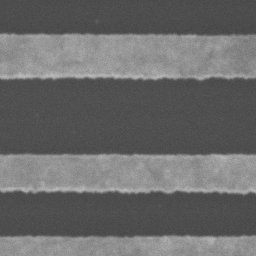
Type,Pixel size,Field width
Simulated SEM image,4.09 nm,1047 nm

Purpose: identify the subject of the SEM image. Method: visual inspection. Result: lines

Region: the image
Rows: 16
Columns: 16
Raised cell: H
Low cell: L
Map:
LLLLLLLLLLLLLLLL
LLLLLLLLLLLLLLLL
HHHHHHHHHHHHHHHH
HHHHHHHHHHHHHHHH
HHHHHHHHHHHHHHHH
LLLLLLLLLLLLLLLL
LLLLLLLLLLLLLLLL
LLLLLLLLLLLLLLLL
LLLLLLLLLLLLLLLL
LLLLLLLLLLLLLLLL
HHHHHHHHHHHHHHHH
HHHHHHHHHHHHHHHH
LLLLLLLLLLLLLLLL
LLLLLLLLLLLLLLLL
LLLLLLLLLLLLLLLL
HHHHHHHHHHHHHHHH